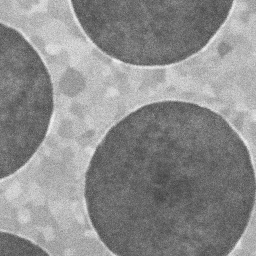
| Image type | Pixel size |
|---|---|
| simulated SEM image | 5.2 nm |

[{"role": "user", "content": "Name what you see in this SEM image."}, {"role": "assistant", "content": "holes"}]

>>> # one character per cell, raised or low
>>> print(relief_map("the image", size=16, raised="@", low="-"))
@@@@@----------@
@@@@@---------@@
--@@@@-------@@@
---@@@@-----@@@@
---@@@@@@@@@@@@@
---@@@@@@@@@@@@@
---@@@@@@---@@@@
---@@@@@------@@
---@@@@--------@
--@@@@----------
-@@@@-----------
@@@@@-----------
@@@@@-----------
@@@@@@----------
@@@@@@---------@
---@@@@--------@